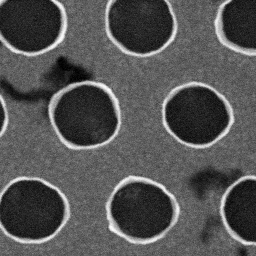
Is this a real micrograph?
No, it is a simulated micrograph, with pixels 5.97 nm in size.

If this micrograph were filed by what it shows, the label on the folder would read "holes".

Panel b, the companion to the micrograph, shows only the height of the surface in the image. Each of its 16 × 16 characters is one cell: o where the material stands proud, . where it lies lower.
....ooo....ooo..
....ooo....ooo..
....ooo....ooo..
oooooooooooooooo
oooooooooooooooo
oooo..ooooo..ooo
ooo....ooo....oo
ooo....ooo....oo
oooo...oooo...oo
oooooooooooooooo
oooooooooooooooo
o..ooooo.oooooo.
....ooo....ooo..
....ooo....ooo..
...ooooo..ooooo.
oooooooooooooooo